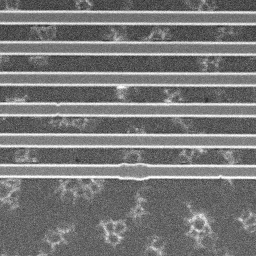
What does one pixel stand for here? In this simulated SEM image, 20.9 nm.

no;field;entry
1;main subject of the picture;parallel lines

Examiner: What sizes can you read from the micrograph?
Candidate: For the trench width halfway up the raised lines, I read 402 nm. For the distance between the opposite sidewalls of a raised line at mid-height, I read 248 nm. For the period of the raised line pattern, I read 641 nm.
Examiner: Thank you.